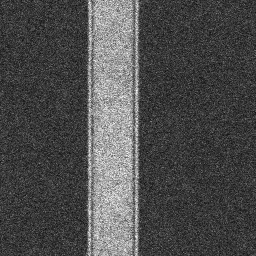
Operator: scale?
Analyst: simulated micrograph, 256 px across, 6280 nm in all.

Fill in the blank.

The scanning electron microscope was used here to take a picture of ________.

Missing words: one or a few lines or trenches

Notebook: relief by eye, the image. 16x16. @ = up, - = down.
@@@@@@---@@@@@@@
@@@@@@---@@@@@@@
@@@@@@---@@@@@@@
@@@@@@---@@@@@@@
@@@@@@---@@@@@@@
@@@@@@---@@@@@@@
@@@@@@---@@@@@@@
@@@@@@---@@@@@@@
@@@@@@---@@@@@@@
@@@@@@---@@@@@@@
@@@@@@---@@@@@@@
@@@@@@---@@@@@@@
@@@@@@---@@@@@@@
@@@@@@---@@@@@@@
@@@@@@---@@@@@@@
@@@@@@---@@@@@@@